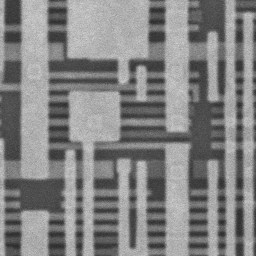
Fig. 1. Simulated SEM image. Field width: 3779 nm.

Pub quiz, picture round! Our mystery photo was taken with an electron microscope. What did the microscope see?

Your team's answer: wiring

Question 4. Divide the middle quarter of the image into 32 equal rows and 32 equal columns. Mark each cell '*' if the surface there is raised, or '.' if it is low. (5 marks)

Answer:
..............**..........*****.
..............**..**......*****.
..............**..**......*****.
..............**..**......*****.
..............**..**......*****.
..................**......*****.
..................**......*****.
.*************....**......*****.
.*************....**......*****.
.*************............*****.
.*************............*****.
.*************............*****.
.*************............*****.
.*************............*****.
.*************............*****.
.*************............*****.
.*************............*****.
.*************..................
.*************..................
....****........................
.....**...................*****.
.....**...................*****.
***..**...................*****.
***..**...................*****.
***..**.......**...*......*****.
***..**.......**..***.....*****.
***..**.......**..***.....*****.
***..**.......**..***.....*****.
***..**.......**..***.....*****.
***..**.......**..***.....*****.
***..**.......**..***.....*****.
***..**.......**..***.....*****.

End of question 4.